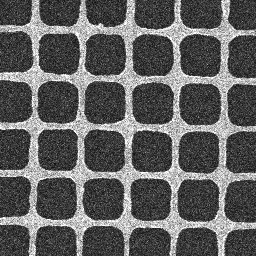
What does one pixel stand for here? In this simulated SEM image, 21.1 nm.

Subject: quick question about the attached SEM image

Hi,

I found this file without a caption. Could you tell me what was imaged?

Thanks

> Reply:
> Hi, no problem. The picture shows a regular array of holes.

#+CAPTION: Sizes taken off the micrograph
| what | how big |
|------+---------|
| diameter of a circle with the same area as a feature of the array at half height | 948 nanometres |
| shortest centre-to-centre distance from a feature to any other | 996 nanometres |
